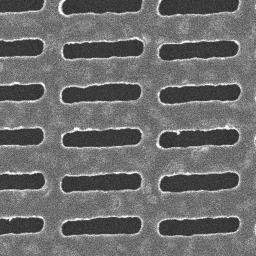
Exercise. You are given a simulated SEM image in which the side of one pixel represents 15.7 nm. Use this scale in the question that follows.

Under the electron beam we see a regular array of holes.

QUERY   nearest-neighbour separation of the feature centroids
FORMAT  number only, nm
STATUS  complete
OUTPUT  683